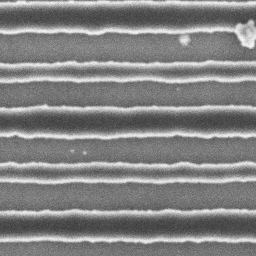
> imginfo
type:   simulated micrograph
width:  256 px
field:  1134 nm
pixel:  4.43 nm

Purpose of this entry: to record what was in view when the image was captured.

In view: lines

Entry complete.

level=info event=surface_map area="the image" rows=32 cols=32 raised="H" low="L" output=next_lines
HHHHHHHHHHHHHHHHHHHHHHHHHHHHHHHH
HHHHHHHHHHHHHHHHHHHHHHHHHHHHHHHH
HHHHHHHHHHHHHHHHHHHHHHHHHHHHHHHH
HHHHHHHHHHHHHHHHHHHHHHHHHHHHHHHH
LLLLLLLLLLLLLLLLLLLLLLLLLLLLLLHH
LLLLLLLLLLLLLLLLLLLLLLLLLLLLLLHH
LLLLLLLLLLLLLLLLLLLLLLLLLLLLLLLL
LLLLLLLLLLLLLLLLLLLLLLLLLLLLLLLL
HHHHHHHHHHHHHHHHHHHHHHHHHHHHHHHH
HHHHHHHHHHHHHHHHHHHHHHHHHHHHHHHH
LLLLLLLLLLLLLLLLLLLLLLLLLLLLLLLL
LLLLLLLLLLLLLLLLLLLLLLLLLLLLLLLL
LLLLLLLLLLLLLLLLLLLLLLLLLLLLLLLL
LLLHHHHHHHHHHHHLHHHHHHHHHHHHHHHH
HHHHHHHHHHHHHHHHHHHHHHHHHHHHHHHH
HHHHHHHHHHHHHHHHHHHHHHHHHHHHHHHH
HHHHHHHHHHHHHHHHHHHHHHHHHHHHHHHH
LLLLLLLLLLLLLLLLLLLLLLLLLLLLLLLL
LLLLLLLLLLLLLLLLLLLLLLLLLLLLLLLL
LLLLLLLLLLLLLLLLLLLLLLLLLLLLLLLL
HHLHHHLHLLHHHHHHHHLLLLHHLLLLLHHH
HHHHHHHHHHHHHHHHHHHHHHHHHHHHHHHH
HHHHHHHHHHHHHHHHHHHHHHHHHHHHHHHH
LLLLLLLLLLLLLLLLLLLLLLLLLLLLLLLL
LLLLLLLLLLLLLLLLLLLLLLLLLLLLLLLL
LLLLLLLLLLLLLLLLLLLLLLLLLLLLLLLL
LHLLLHHLHHHHHLLHHHHLHHHLHHHHHHHH
HHHHHHHHHHHHHHHHHHHHHHHHHHHHHHHH
HHHHHHHHHHHHHHHHHHHHHHHHHHHHHHHH
HHHHHHHHHHHHHHHHHHHHHHHHHHHHHHHH
LLLLLLLLLLLLLLLLLLLLLLLLLLLLLLLL
LLLLLLLLLLLLLLLLLLLLLLLLLLLLLLLL